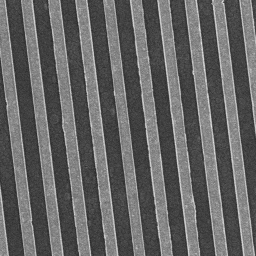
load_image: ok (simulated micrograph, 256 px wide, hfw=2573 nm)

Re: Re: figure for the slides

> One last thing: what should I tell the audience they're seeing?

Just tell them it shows parallel lines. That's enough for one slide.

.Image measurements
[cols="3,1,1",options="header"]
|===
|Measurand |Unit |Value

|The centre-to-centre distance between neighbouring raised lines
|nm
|273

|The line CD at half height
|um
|0.112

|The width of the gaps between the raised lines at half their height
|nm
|161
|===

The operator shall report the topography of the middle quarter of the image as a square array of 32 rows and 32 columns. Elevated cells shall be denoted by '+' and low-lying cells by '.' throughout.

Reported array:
+....+++....++.....++.....++....
+....+++....+++....++.....++....
+....+++....+++....+++....++....
+....+++....+++....+++....+++...
+....+++....+++....+++....+++...
+.....++....+++....+++....+++...
++....++.....++....+++....+++...
++....+++....++.....++....+++...
++....+++....++.....++.....++...
++....+++....+++....++.....++...
++....+++....+++....+++....++...
++....+++....+++....+++....+++..
++....+++....+++....+++....+++..
++.....++....+++....+++....+++..
+++....++.....++....+++....+++..
+++....++.....++.....++....+++..
+++....+++....++.....++....+++..
+++....+++....+++....++.....++..
+++....+++....+++....+++....++..
+++....+++....+++....+++....+++.
.++....+++....+++....+++....+++.
.++.....++....+++....+++....+++.
.++.....++.....++....+++....+++.
.+++....++.....++....+++....+++.
.+++....+++....++.....++....+++.
.+++....+++....+++....++.....++.
.+++....+++....+++....+++....++.
.+++....+++....+++....+++....++.
..++....+++....+++....+++....+++
..++.....++....+++....+++....+++
..++.....++....+++....+++....+++
..+++....++.....++....+++....+++